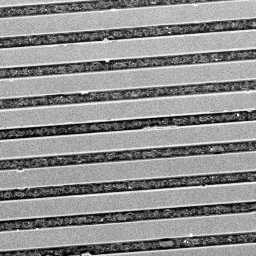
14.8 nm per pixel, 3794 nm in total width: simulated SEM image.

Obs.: parallel lines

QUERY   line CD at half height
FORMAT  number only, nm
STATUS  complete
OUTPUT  281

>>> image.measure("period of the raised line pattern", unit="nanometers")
451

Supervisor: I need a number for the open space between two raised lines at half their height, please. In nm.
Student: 177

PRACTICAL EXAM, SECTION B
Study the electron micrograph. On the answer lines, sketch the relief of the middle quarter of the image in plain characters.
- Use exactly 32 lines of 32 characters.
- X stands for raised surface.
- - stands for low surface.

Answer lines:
------------------------------XX
-----------------XXXXXXXXXXXXXXX
---XXXXXXXXXXXXXXXXXXXXXXXXXXXXX
XXXXXXXXXXXXXXXXXXXXXXXXXXXXXXXX
XXXXXXXXXXXXXXXXXXXXXXXXXXXXXXXX
XXXXXXXXXXXXXXXXXXXXXXXX--------
XXXXXXXXXXX---------------------
--------------------------------
-----------------------XXXXXXXXX
----------XXXXXXXXXXXXXXXXXXXXXX
XXXXXXXXXXXXXXXXXXXXXXXXXXXXXXXX
XXXXXXXXXXXXXXXXXXXXXXXXXXXXXXXX
XXXXXXXXXXXXXXXXXXXXXXXXXXXXXXX-
XXXXXXXXXXXXXXXXXX--------------
XXXXX---------------------------
--------------------------------
-------------------XXXXXXXXXXXXX
-------XXXXXXXXXXXXXXXXXXXXXXXXX
XXXXXXXXXXXXXXXXXXXXXXXXXXXXXXXX
XXXXXXXXXXXXXXXXXXXXXXXXXXXXXXXX
XXXXXXXXXXXXXXXXXXXXXXXXXXXX----
XXXXXXXXXXXXXXX-----------------
XX------------------------------
---------------------------XXXXX
--------------XXXXXXXXXXXXXXXXXX
-XXXXXXXXXXXXXXXXXXXXXXXXXXXXXXX
XXXXXXXXXXXXXXXXXXXXXXXXXXXXXXXX
XXXXXXXXXXXXXXXXXXXXXXXXXXXXXXXX
XXXXXXXXXXXXXXXXXXXXXX----------
XXXXXXXXX-----------------------
--------------------------------
------------------------XXXXXXXX